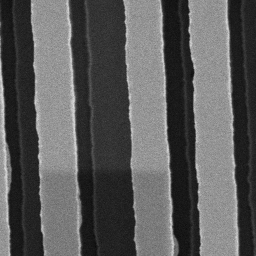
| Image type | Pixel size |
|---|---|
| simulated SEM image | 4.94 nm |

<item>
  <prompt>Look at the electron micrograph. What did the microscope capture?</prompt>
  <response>lines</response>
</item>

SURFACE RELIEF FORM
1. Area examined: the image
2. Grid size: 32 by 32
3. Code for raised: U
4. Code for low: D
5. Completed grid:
DDDDUUUUUDDDDDDDUUUUDDDDUUUUDDDD
DDDDUUUUUDDDDDDDUUUUDDDDUUUUDDDD
DDDDUUUUUDDDDDDDUUUUDDDDUUUUDDDD
DDDDUUUUUDDDDDDDUUUUDDDDUUUUUDDD
DDDDUUUUUDDDDDDDUUUUDDDDUUUUUDDD
DDDDUUUUUDDDDDDDUUUUDDDDUUUUUDDD
DDDDUUUUUDDDDDDDUUUUDDDDUUUUUDDD
DDDDUUUUUDDDDDDDUUUUUDDDUUUUUDDD
DDDDUUUUUDDDDDDDUUUUUDDDUUUUUDDD
DDDDUUUUUDDDDDDDUUUUUDDDUUUUUDDD
DDDDUUUUUDDDDDDDUUUUUDDDUUUUUDDD
DDDDUUUUUDDDDDDDUUUUUDDDUUUUUDDD
DDDDUUUUUDDDDDDDUUUUUDDDUUUUUDDD
DDDDUUUUUDDDDDDDUUUUUDDDUUUUUDDD
DDDDDUUUUDDDDDDDUUUUUDDDUUUUUDDD
DDDDDUUUUDDDDDDDUUUUUDDDUUUUUDDD
UDDDDUUUUDDDDDDDUUUUUDDDDUUUUDDD
UDDDDUUUUDDDDDDDUUUUUDDDDUUUUDDD
UDDDDUUUUUDDDDDDDUUUUDDDDUUUUDDD
UDDDDUUUUUDDDDDDUUUUUDDDDUUUUDDD
UDDDDUUUUUDDDDDDUUUUUDDDDUUUUDDD
UDDDDUUUUUDDDDDDDUUUUDDDDUUUUDDD
UDDDDUUUUUDDDDDDDUUUUDDDDUUUUDDD
UDDDDUUUUUDDDDDDDUUUUDDDDUUUUDDD
UDDDDUUUUUDDDDDDDUUUUDDDDUUUUDDD
UDDDDUUUUUDDDDDDDUUUUUDDDUUUUUDD
UDDDDUUUUUDDDDDDDUUUUUDDDUUUUUDD
UDDDDUUUUUDDDDDDDUUUUUDDDUUUUUDD
UDDDDUUUUUDDDDDDDUUUUUDDDUUUUUDD
UDDDDUUUUUDDDDDDDUUUUUDDDUUUUUDD
UDDDDUUUUUDDDDDDDUUUUUDDDUUUUUDD
UDDDDUUUUUDDDDDDDUUUUUDDDUUUUUDD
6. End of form